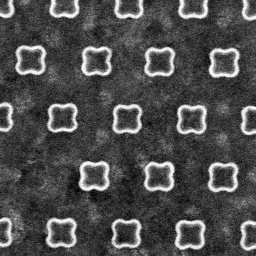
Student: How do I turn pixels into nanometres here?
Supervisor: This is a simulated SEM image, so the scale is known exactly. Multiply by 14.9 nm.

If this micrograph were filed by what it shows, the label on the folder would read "a regular array of raised bodies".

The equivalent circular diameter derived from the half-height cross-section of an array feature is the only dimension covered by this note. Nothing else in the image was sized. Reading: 406 nm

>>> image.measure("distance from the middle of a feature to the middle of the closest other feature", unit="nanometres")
957